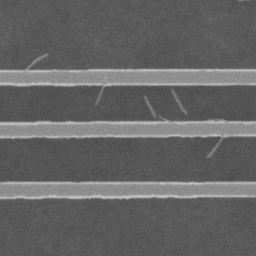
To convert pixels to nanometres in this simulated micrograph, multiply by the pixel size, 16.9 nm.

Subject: lines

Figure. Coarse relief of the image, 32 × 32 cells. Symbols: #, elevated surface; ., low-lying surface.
................................
................................
................................
................................
................................
................................
................................
................................
................................
################################
########################.#####.#
................................
................................
................................
................................
################################
################################
................................
................................
................................
................................
................................
................................
################################
################################
................................
................................
................................
................................
................................
................................
................................